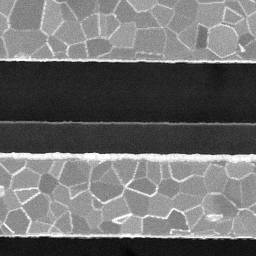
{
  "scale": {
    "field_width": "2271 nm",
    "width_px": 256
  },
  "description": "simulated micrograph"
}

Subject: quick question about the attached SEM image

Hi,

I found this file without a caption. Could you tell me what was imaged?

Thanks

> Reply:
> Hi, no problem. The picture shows lines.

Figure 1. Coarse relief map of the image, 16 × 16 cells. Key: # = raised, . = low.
################
################
################
################
................
................
................
................
................
................
################
################
################
################
################
................